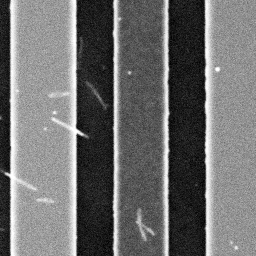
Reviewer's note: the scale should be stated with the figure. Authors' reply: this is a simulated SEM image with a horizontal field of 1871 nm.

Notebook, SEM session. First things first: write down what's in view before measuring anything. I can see lines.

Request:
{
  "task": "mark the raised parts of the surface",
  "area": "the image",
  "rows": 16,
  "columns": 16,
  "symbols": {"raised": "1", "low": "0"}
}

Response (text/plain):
0111100111000111
0111100111000111
0111100111000111
0111100111000111
0111100111000111
0111100111000111
0111100111000111
0111100111000111
0111100111000111
0111100111000111
0111100111000111
0111100111000111
0111100111000111
0111100111000111
0111100111000111
0111100111000111